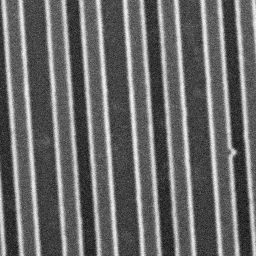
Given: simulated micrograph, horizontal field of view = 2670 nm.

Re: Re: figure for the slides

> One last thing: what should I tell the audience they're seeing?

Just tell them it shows parallel lines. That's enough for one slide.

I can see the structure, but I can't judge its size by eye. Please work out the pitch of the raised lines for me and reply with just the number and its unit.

0.413 um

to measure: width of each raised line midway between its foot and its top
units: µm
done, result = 0.183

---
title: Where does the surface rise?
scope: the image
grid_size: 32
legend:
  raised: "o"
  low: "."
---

ooo...oo..oo....oo..oo...oo...oo
ooo...oo..oo....oo..oo...ooo..oo
.oo...oo..oo....oo..oo...ooo..oo
.oo...oo..ooo...oo..oo....oo..oo
.oo...oo..ooo...oo..oo....oo..oo
.oo...oo...oo...oo..oo....oo..oo
.oo...oo...oo...oo..ooo...oo..oo
.oo...ooo..oo...oo..ooo...oo..oo
.oo...ooo..oo...oo...oo...oo..oo
.oo....oo..oo...oo...oo...oo..oo
.oo....oo..oo...ooo..oo...oo..oo
.oo....oo..oo...ooo..oo...oo..oo
.oo....oo..oo...ooo..oo...oo..oo
.ooo...oo..oo....oo..oo...oo...o
.ooo...oo..oo....oo..oo...oo...o
.ooo...oo..oo....oo..oo...ooo..o
..oo...oo..oo....oo..oo...ooo..o
..oo...oo..ooo...oo..oo....oo..o
..oo...oo..ooo...oo..oo....oo..o
..oo...oo...oo...oo..oo....oo..o
..oo...oo...oo...oo..oo....oo..o
..oo...ooo..oo...oo..ooo...oo..o
..oo...ooo..oo...oo...oo...oo..o
..oo....oo..oo...oo...oo...oo..o
..oo....oo..oo...ooo..oo...oo..o
..oo....oo..oo...ooo..oo...oo..o
..oo....oo..oo...ooo..oo...oo..o
..ooo...oo..oo....oo..oo...oo...
..ooo...oo..oo....oo..oo...oo...
..ooo...oo..oo....oo..oo...ooo..
...oo...oo..oo....oo..oo...ooo..
o..oo...oo..ooo...oo..oo....oo..